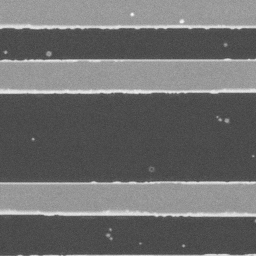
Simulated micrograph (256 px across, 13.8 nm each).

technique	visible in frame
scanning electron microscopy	lines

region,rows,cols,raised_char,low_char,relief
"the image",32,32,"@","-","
@@@@@@@@@@@@@@@@@@@@@@@@@@@@@@@@
@@@@@@@@@@@@@@@@@@@@@@@@@@@@@@@@
@@@@@@@@@@@@@@@@@@@@@@@@@@@@@@@@
--------------------------------
--------------------------------
--------------------------------
--------------------------------
----------------------------@--@
@@@@@@@@@@@@@@@@@@@@@@@@@@@@@@@@
@@@@@@@@@@@@@@@@@@@@@@@@@@@@@@@@
@@@@@@@@@@@@@@@@@@@@@@@@@@@@@@@@
----@@-----------@--------------
--------------------------------
--------------------------------
--------------------------------
--------------------------------
--------------------------------
--------------------------------
--------------------------------
--------------------------------
--------------------------------
--------------------------------
--------------------------------
@@@@@@@@@@@@@@@@@@@@@@@@@@@@@@@@
@@@@@@@@@@@@@@@@@@@@@@@@@@@@@@@@
@@@@@@@@@@@@@@@@@@@@@@@@@@@@@@@@
@@@@@@@@@@@@@@@@@@@@@@@@@@@@@@@@
--------------------------------
--------------------------------
--------------------------------
--------------------------------
--------------------------------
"